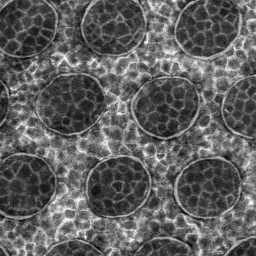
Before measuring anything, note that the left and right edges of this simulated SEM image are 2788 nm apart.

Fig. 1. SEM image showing raised bodies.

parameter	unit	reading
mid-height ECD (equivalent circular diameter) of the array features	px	63.8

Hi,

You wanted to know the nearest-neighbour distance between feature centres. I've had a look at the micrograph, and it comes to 992 nanometres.